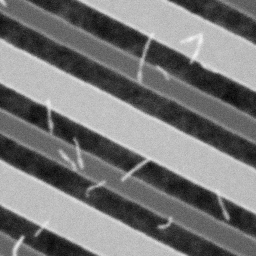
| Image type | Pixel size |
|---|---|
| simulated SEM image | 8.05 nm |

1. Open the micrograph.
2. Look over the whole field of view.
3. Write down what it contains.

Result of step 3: lines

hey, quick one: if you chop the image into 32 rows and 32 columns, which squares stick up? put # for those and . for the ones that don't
####.......###########......####
######.......###########......##
..######.......###########......
....######.......###########....
......######......############..
#.......######......############
###.......######......##########
#####.......######......########
#######.......######......######
#########......#######......####
###########......######.......##
..###########......######.......
....###########.......#####.....
......###########......######...
##......###########......######.
####......###########......#####
######......###########......###
..######......###########......#
....######......###########.....
......######......###########...
#.......######......###########.
###......#######......##########
#####......######.......########
#######......######.......######
#########......######.......####
###########......######.......##
..###########......######.......
....###########......######.....
.....###########.......######...
#.......##########.......######.
###.......##########.......#####
#####.......##########.......###